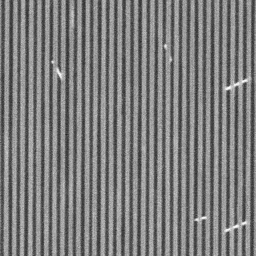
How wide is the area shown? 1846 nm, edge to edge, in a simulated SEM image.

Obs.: parallel lines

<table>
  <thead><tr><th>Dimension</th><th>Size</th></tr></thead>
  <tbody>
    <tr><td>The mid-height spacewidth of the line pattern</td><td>0.0343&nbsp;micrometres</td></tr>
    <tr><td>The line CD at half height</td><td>3.74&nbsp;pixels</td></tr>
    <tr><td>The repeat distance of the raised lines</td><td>0.0581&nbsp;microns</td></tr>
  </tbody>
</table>